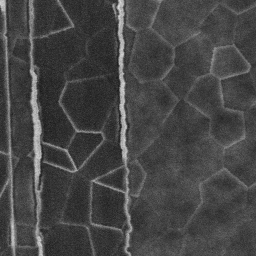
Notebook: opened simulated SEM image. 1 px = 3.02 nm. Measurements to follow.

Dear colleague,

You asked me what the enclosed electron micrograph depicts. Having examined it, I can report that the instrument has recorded one or a few lines or trenches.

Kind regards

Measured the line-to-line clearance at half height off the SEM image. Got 72.8 nm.